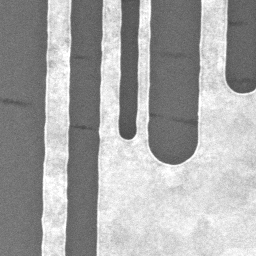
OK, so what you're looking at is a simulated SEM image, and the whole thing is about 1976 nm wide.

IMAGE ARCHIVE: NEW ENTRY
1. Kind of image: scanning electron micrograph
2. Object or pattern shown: groups of lines, slits or small figures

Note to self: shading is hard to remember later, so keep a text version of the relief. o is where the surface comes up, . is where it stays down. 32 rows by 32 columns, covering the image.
......ooo....oo...o......ooo....
......ooo....oo...o......ooo....
......ooo....oo...o......ooo....
......ooo....oo..oo......ooo....
......ooo....oo..oo......ooo....
......ooo....oo..oo......ooo....
......ooo....oo..oo......ooo....
......ooo....oo..oo......ooo....
......ooo....oo..oo......ooo....
......ooo....oo..oo......ooo....
......ooo....oo..oo......ooo....
......ooo....oo..oo......oooo...
......ooo....oo..o.......ooooooo
......ooo....oo..o.......ooooooo
......ooo....oo..o.......ooooooo
......ooo....oo..o.......ooooooo
......ooo....oo..o.......ooooooo
......oo.....ooooo.......ooooooo
......oo.....oooooo......ooooooo
......oo....ooooooo.....oooooooo
......oo....ooooooooo..ooooooooo
......oo....oooooooooooooooooooo
.....ooo.....ooooooooooooooooooo
.....ooo....oooooooooooooooooooo
.....ooo....oooooooooooooooooooo
.....ooo....oooooooooooooooooooo
.....ooo....oooooooooooooooooooo
.....ooo....oooooooooooooooooooo
.....ooo....oooooooooooooooooooo
.....ooo....oooooooooooooooooooo
.....ooo....oooooooooooooooooooo
.....ooo....oooooooooooooooooooo